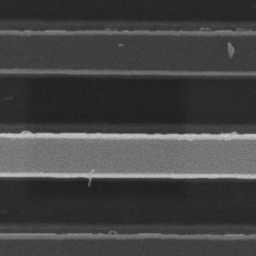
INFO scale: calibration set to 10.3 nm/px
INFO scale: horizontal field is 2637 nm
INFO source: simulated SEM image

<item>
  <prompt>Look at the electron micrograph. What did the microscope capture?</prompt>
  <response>lines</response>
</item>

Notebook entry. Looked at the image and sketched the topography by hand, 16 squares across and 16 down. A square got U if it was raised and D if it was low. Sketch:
DDDDDDDDDDDDDDDD
UUUUUUUUUUUDDDDD
UUUUUUUUUUUUUUUU
UUUUUUUUUUUUUUUU
UUUUUUUUUUUUUUUU
DDDDDDDDDDDDDDDD
DDDDDDDDDDDDDDDD
DDDDDDDDDDDDDDDD
UUUUUUUUUUUUUUUU
UUUUUUUUUUUUUUUU
UUUUUUUUUUUUUUUU
DDDDDDDDDDDDDDDD
DDDDDDDDDDDDDDDD
DDDDDDDDDDDDDDDD
UUUUUUUUUUUUUUUU
UUUUUUUUUUUUUUUU